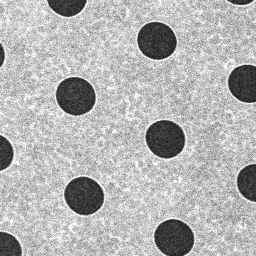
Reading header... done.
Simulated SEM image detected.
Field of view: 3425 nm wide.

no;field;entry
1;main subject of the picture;holes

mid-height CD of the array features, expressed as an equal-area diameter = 523 nm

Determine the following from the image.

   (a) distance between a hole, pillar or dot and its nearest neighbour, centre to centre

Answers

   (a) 1320 nm